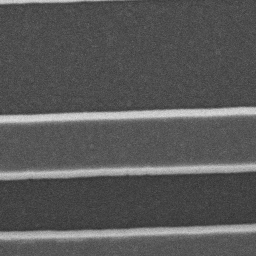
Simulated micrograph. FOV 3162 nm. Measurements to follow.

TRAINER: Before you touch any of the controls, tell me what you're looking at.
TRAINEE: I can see one or a few lines or trenches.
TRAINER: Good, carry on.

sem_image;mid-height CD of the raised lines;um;0.72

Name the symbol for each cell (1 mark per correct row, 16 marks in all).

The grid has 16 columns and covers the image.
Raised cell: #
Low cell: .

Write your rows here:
................
................
................
................
................
................
................
################
################
################
################
................
................
................
........########
################